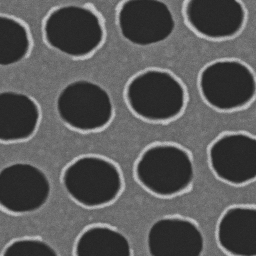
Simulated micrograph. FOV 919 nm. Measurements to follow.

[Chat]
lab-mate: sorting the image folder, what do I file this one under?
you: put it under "holes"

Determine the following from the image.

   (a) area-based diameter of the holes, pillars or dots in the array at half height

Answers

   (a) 0.179 µm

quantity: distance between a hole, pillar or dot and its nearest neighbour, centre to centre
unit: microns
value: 0.263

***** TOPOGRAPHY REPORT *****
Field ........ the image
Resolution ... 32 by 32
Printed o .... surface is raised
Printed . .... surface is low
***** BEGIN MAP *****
oooooooooooooooo....oooo......oo
ooooooo....oooo......ooo......oo
.ooooo......ooo.......oo......oo
...ooo.......oo.......ooo.....oo
...ooo.......ooo.....ooooo..oooo
...ooo......ooooo..ooooooooooooo
...ooooo...ooooooooooooooooooooo
..oooooooooooooooooooooooooooooo
oooooooooooooooooooooooooo.....o
oooooooooooooooooo...oooo......o
ooooooooo...oooo......ooo.......
oooooooo.....ooo.......oo.......
....ooo.......oo.......ooo.....o
....ooo.......ooo......oooo..ooo
.....ooo......oooo...ooooooooooo
....ooooo....ooooooooooooooooooo
....oooooooooooooooooooooooooooo
oooooooooooooooooooooooooooo....
oooooooooooooooooooo..ooooo.....
oooooooooooooooooo.....ooo......
ooooooooo.....ooo.......ooo.....
.....ooo.......oo.......ooo.....
......oo.......ooo......oooo...o
......oo.......oooo....ooooooooo
......ooo.....oooooooooooooooooo
.....oooooo.oooooooooooooooooooo
ooooooooooooooooooooooooooooo...
oooooooooooooooooooooooooooo....
ooooooooooooooooooo.....ooo.....
oooooooooo.....oooo......oo.....
oo....oooo......ooo......ooo....
o......ooo......ooo......oooo...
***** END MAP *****